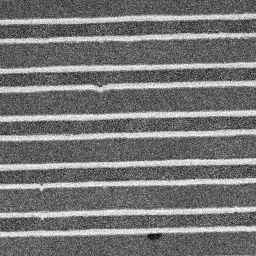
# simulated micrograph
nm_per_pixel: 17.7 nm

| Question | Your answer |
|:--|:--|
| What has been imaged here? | parallel lines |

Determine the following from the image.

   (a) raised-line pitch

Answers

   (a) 856 nm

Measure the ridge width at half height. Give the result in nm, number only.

515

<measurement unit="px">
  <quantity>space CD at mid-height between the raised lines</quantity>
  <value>19.4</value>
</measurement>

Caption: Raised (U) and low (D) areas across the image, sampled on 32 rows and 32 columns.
UUUUUUUUUUUUUUUUUUUUUUUUUUUUUUUU
UUUUUUUUUUUUUUUUUUUUUUUUUUUUUUUU
UUUUUUUUUDDDDDDDDDDDDDDDDDDDDDDD
DDDDDDDDDDDDDDDDDDDDDDDDDDDDDDDD
DDDDDDDDDDDDDDDDDDDDDDDDDDDUUUUU
UUUUUUUUUUUUUUUUUUUUUUUUUUUUUUUU
UUUUUUUUUUUUUUUUUUUUUUUUUUUUUUUU
UUUUUUUUUUUUUUUUUUUUUUUUUUUUUUUU
UUUUUUUUUUUDDDDDDDDDDDDDDDDDDDDD
DDDDDDDDDDDDDDDDDDDDDDDDDDDDDDDD
DDDDDDDDDDDDDDDDDDDDDDDDDDDDUUDD
UUUUUUUUUUUUUUUUUUUUUUUUUUUUUUUU
UUUUUUUUUUUUUUUUUUUUUUUUUUUUUUUU
UUUUUUUUUUUUUUUUUUUUUUUUUUUUUUUU
UUUUUUUUUUUUUUDDDDDDDDDDDDDDDDDD
DDDDDDDDDDDDDDDDDDDDDDDDDDDDDDDD
DDDDDDDDDDDDDDDDDDDDDDDDDDDDDDDU
UUUUUUUUUUUUUUUUUUUUUUUUUUUUUUUU
UUUUUUUUUUUUUUUUUUUUUUUUUUUUUUUU
UUUUUUUUUUUUUUUUUUUUUUUUUUUUUUUU
UUUUUUUUUUUUDUUUUDDDDDDDDDDDDDDD
DDDDDDDDDDDDDDDDDDDDDDDDDDDDDDDD
DDDDDDDDDDDDDDDDDDDDDDDDDDDDDDDD
UUUUUUUUUUUUUUUUUUUUUUUUUUUUUUUU
UUUUUUUUUUUUUUUUUUUUUUUUUUUUUUUU
UUUUUUUUUUUUUUUUUUUUUUUUUUUUUUUU
UUUUUUUUUUUUUUDDDUUDDDDDDDDDDDDD
DDDDDDDDDDDDDDDDDDDDDDDDDDDDDDDD
DDDDDDDDDDDDDDDDDDDDDDDDDDDDDDDD
UUUUUUUUUUUUUUUUUUUUUUUUUUUUUUUU
UUUUUUUUUUUUUUUUUUUUUUUUUUUUUUUU
UUUUUUUUUUUUUUUUUUUUUUUUUUUUUUUU